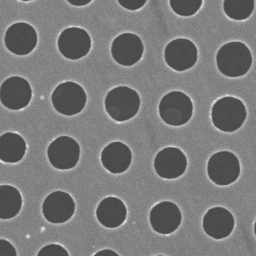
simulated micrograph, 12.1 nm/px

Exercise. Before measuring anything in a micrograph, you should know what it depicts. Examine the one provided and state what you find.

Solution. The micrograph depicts a regular array of holes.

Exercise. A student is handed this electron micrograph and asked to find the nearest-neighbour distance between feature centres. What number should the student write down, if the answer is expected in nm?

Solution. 646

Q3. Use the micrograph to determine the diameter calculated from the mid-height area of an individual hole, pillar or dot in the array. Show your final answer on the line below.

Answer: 398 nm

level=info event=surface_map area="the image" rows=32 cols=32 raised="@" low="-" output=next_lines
@@@@@@@@@--@@@@---@@@----@@@----
@@@@@@@@@@@@@@@@@@@@@@---@@@----
@@@@@@@@@@@@@@@@@@@@@@@@@@@@@@@@
@---@@@@@-@@@@@@@@@@@@@@@@@@@@@@
@----@@----@@@@--@@@@@@@@@@@@@@@
@----@@----@@@----@@@---@@@@---@
@---@@@@---@@@----@@@----@@----@
@@@@@@@@@@@@@@---@@@@----@@----@
@@@@@@@@@@@@@@@@@@@@@@--@@@----@
@@@@@@@@@@@@@@@@@@@@@@@@@@@@--@@
----@@@@--@@@@@@@@@@@@@@@@@@@@@@
----@@@----@@@---@@@@@-@@@@@@@@@
----@@-----@@----@@@----@@@---@@
@--@@@@---@@@----@@@----@@@----@
@@@@@@@@@@@@@@---@@@----@@-----@
@@@@@@@@@@@@@@@@@@@@@--@@@@---@@
@@@@@@@@@@@@@@@@@@@@@@@@@@@@@@@@
---@@@@--@@@@@@@@@@@@@@@@@@@@@@@
---@@@----@@@---@@@@@-@@@@@@@@@@
---@@@----@@@---@@@----@@@@--@@@
@@@@@@----@@@---@@@----@@@----@@
@@@@@@@@@@@@@@-@@@@@---@@@----@@
@@@@@@@@@@@@@@@@@@@@@@@@@@---@@@
--@@@@@@@@@@@@@@@@@@@@@@@@@@@@@@
---@@@---@@@@@@@@@@@@@@@@@@@@@@@
---@@----@@@---@@@@@--@@@@@@@@@@
--@@@----@@@----@@@----@@@---@@@
@@@@@@---@@@----@@@----@@----@@@
@@@@@@@@@@@@@@@@@@@---@@@----@@@
@@@@@@@@@@@@@@@@@@@@@@@@@@--@@@@
-@@@@@@@@@@@@@@@@@@@@@@@@@@@@@@@
--@@@---@@@@--@@@@@@@@@@@@@@@@@@